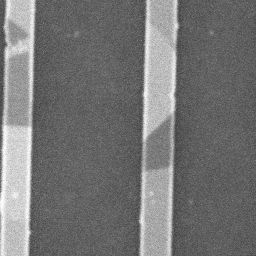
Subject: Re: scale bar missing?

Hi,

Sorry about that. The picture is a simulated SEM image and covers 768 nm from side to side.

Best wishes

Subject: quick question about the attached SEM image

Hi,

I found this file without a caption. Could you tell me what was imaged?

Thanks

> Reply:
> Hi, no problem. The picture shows one or a few lines or trenches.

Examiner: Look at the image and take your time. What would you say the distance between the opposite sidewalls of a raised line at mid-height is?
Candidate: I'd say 83.8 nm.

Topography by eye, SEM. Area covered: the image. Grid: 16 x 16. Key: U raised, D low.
UUDDDDDDDUUDDDDD
UUDDDDDDDUUDDDDD
UUDDDDDDDUUDDDDD
UUDDDDDDDUUDDDDD
UUDDDDDDDUUDDDDD
UUDDDDDDDUUDDDDD
UUDDDDDDDUUDDDDD
UUDDDDDDDUUDDDDD
UUDDDDDDDUUDDDDD
UUDDDDDDDUUDDDDD
UUDDDDDDDUUDDDDD
UUDDDDDDDUUDDDDD
UUDDDDDDDUUDDDDD
UUDDDDDDDUUDDDDD
UUDDDDDDDUUDDDDD
UUDDDDDDDUUDDDDD